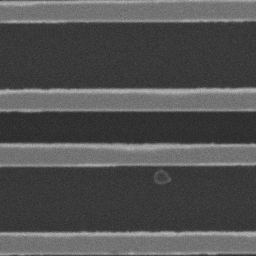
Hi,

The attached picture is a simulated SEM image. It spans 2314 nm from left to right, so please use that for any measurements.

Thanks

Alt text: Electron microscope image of lines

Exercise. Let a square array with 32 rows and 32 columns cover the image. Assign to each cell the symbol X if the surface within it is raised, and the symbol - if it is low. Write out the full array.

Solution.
XXXXXXXXXXXXXXXXXXXXXXXXXXXXXXXX
XXXXXXXXXXXXXXXXXXXXXXXXXXXXXXXX
XXXXXXXXXXXXXXXXXXXXXXXXXXXXXXXX
--------------------------------
--------------------------------
--------------------------------
--------------------------------
--------------------------------
--------------------------------
--------------------------------
--------------------------------
XXXXXXXXXXXXXXXXXXXXXXXXXXXXXXXX
XXXXXXXXXXXXXXXXXXXXXXXXXXXXXXXX
XXXXXXXXXXXXXXXXXXXXXXXXXXXXXXXX
--------------------------------
--------------------------------
--------------------------------
--------------------------------
XXXXXXXXXXXXXXXXXXXXXXXXXXXXXXXX
XXXXXXXXXXXXXXXXXXXXXXXXXXXXXXXX
XXXXXXXXXXXXXXXXXXXXXXXXXXXXXXXX
--------------------------------
--------------------------------
--------------------------------
--------------------------------
--------------------------------
--------------------------------
--------------------------------
--------------------------------
XXXXXXXXXXXXXXXXXXXXXXXXXXXXXXXX
XXXXXXXXXXXXXXXXXXXXXXXXXXXXXXXX
XXXXXXXXXXXXXXXXXXXXXXXXXXXXXXXX